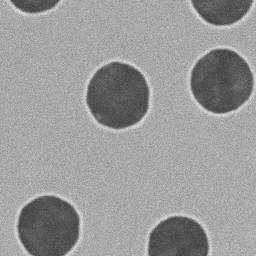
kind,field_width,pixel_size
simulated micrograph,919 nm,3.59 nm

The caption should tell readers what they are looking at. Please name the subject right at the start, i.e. holes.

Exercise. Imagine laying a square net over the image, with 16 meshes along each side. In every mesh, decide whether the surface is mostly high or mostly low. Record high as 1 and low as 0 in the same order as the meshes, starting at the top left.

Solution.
1001111111110000
1111111111111011
1111111111111111
1111111111111001
1111110001110000
1111100001110000
1111100001110001
1111110001111111
1111111111111111
1111111111111111
1111111111111111
1111111111111111
1100111111111111
1000011111111111
1000011110000111
1100011110000111